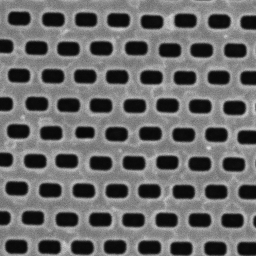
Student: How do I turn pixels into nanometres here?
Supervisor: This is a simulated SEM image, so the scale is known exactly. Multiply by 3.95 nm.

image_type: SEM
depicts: a regular array of holes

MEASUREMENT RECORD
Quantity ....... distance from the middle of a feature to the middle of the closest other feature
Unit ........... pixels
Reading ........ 32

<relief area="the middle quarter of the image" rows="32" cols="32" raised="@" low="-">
@@@@@@@@@@@@@@@@@@@@@@@@@@@@@@@@
@@@----@@@@----@@@@@---@@@@@@@@@
@@------@@@-----@@@------@@-----
@@------@@------@@@------@@-----
@@@-----@@@-----@@@-----@@@@----
@@@@@@@@@@@@@@@@@@@@@@@@@@@@@@@@
@@@@@@@@@@@@@@@@@@@@@@@@@@@@@@@@
@@@@@@@@@@@@@@@@@@@@@@@@@@@@@@@@
---@@@@@---@@@@@@@@@@@@@--@@@@@@
----@@------@@@-----@@@------@@-
----@@------@@@------@@------@@-
----@@@-----@@@-----@@@------@@-
@@@@@@@@@@@@@@@@@@@@@@@@@@@@@@@@
@@@@@@@@@@@@@@@@@@@@@@@@@@@@@@@@
@@@@@@@@@@@@@@@@@@@@@@@@@@@@@@@@
@@@@--@@@@@@@@@@@@@@---@@@@@@@@@
@@@-----@@------@@@-----@@@-----
@@@-----@@------@@@------@@-----
@@@----@@@------@@@-----@@@-----
@@@@@@@@@@@@@@@@@@@@@@@@@@@@@--@
@@@@@@@@@@@@@@@@@@@@@@@@@@@@@@@@
@@@@@@@@@@@@@@@@@@@@@@@@@@@@@@@@
--@@@@@@@@@@@@@@@@@@@@@@@@@@@@@@
---@@@@-----@@@-----@@@------@@@
----@@------@@@-----@@@------@@-
---@@@------@@@-----@@@------@@-
@@@@@@@----@@@@@----@@@@@--@@@@@
@@@@@@@@@@@@@@@@@@@@@@@@@@@@@@@@
@@@@@@@@@@@@@@@@@@@@@@@@@@@@@@@@
@@@@@@@@@@@@@@@@@@@@@@@@@@@@@@@@
@@-----@@@@-----@@@-----@@@-----
@@------@@------@@@-----@@@-----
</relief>